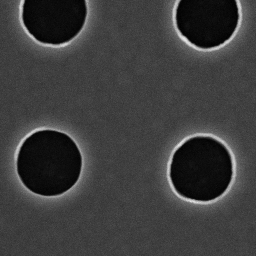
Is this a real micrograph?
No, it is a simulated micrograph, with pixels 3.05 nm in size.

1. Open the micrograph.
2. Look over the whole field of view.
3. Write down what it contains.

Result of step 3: holes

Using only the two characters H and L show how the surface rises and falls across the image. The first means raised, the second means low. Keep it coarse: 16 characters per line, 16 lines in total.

HLLLLHHHHHHLLLLH
HHLLLHHHHHHLLLLH
HHLLHHHHHHHHLLHH
HHHHHHHHHHHHHHHH
HHHHHHHHHHHHHHHH
HHHHHHHHHHHHHHHH
HHHHHHHHHHHHHHHH
HHHHHHHHHHHHHHHH
HHLLHHHHHHHHHHHH
HLLLLHHHHHHLLLHH
HLLLLHHHHHHLLLHH
HHLLLHHHHHHLLLHH
HHHHHHHHHHHHLHHH
HHHHHHHHHHHHHHHH
HHHHHHHHHHHHHHHH
HHHHHHHHHHHHHHHH